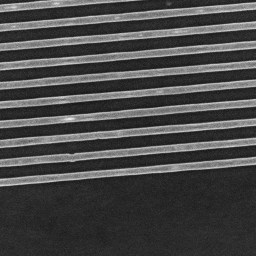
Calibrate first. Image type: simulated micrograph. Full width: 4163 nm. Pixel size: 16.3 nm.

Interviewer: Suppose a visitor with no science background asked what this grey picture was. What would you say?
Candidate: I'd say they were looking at parallel lines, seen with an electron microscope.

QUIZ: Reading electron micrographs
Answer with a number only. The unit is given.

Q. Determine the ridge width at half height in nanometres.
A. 115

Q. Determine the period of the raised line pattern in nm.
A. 314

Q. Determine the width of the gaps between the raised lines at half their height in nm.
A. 200